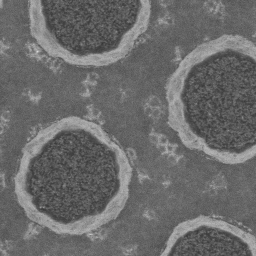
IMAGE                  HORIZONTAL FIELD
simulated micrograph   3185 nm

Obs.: raised bodies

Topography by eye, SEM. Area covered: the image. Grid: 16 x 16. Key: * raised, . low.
..*******.......
..*******.......
...*****........
....***.....****
...........*****
...........*****
...........*****
...........*****
...***......****
..*****......***
.*******........
.*******........
..*****.........
...****.........
...........****.
..........******